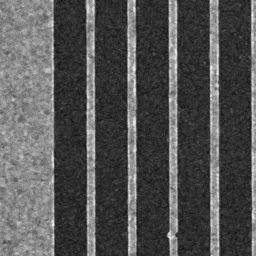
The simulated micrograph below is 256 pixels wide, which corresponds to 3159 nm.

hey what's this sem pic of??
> parallel lines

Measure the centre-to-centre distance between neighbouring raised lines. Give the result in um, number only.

0.509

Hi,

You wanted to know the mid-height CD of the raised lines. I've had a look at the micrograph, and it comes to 0.0879 microns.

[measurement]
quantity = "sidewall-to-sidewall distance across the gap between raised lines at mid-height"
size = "0.418 µm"